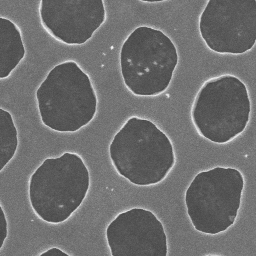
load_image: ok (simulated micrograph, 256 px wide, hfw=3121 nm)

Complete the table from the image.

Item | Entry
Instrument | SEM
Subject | holes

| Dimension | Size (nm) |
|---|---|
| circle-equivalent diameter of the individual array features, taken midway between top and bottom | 758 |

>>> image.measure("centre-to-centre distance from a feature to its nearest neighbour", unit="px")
88.1